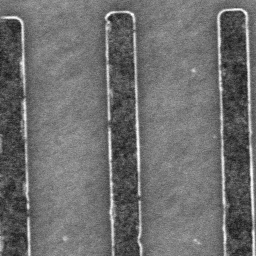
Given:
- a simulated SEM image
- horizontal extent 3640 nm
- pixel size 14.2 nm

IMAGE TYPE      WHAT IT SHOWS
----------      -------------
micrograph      one or a few lines or trenches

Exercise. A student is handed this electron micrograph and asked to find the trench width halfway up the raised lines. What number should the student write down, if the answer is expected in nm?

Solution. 1200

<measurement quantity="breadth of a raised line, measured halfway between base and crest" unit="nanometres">391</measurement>